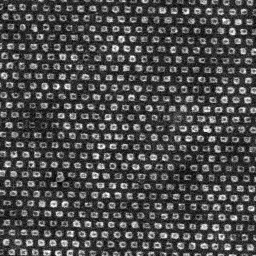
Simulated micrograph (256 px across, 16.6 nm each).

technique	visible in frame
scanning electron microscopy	a regular array of raised bodies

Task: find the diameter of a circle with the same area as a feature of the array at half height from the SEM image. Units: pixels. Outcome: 5.86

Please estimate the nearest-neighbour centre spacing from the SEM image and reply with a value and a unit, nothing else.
182 nanometres